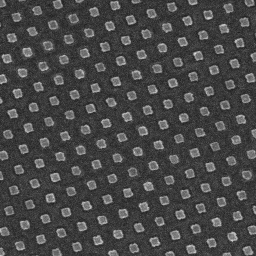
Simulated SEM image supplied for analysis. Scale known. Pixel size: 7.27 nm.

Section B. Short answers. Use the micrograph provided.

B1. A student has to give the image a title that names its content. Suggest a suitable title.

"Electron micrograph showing a regular array of raised bodies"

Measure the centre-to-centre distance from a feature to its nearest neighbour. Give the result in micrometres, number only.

0.153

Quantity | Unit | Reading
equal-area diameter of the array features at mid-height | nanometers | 64